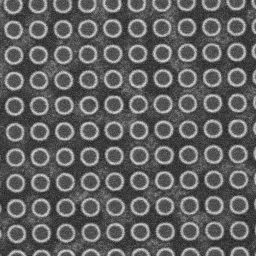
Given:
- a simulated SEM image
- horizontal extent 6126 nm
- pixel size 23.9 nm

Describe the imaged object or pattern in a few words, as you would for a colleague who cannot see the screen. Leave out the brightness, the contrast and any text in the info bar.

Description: a regular array of raised bodies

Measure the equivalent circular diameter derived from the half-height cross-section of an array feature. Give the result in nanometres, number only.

403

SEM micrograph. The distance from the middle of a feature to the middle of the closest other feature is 590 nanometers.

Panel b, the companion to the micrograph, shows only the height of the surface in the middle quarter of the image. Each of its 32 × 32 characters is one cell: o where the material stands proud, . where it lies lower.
................................
................................
o....oo....ooo...ooo...ooo...ooo
oo..oooo..oooo...ooo...oooo..ooo
oo..oooo..oooo...ooo...oooo..ooo
o....ooo...oo....ooo..........o.
................................
................................
o.....o....ooo...ooo....oo...ooo
oo..oooo..oooo...oooo..oooo..ooo
oo..oooo...oooo..oooo..oooo..ooo
oo...ooo...ooo...ooo...ooo....oo
................................
................................
........................o.......
oo...ooo...ooo...ooo...oooo..ooo
oo..oooo...ooo...oooo..oooo..ooo
oo..oooo...ooo...oooo..oooo..ooo
o....oo.....o.....oo............
................................
................................
o....ooo...ooo...ooo....ooo..ooo
oo..oooo...oooo..oooo..oooo..ooo
oo..oooo...oooo..oooo..oooo..ooo
oo...ooo...ooo....oo....oo....oo
................................
................................
..................oo....oo....oo
oo...ooo...ooo...oooo..oooo..ooo
oo...oooo..oooo..oooo..oooo..ooo
oo...ooo...ooo...oooo..oooo...oo
o...............................